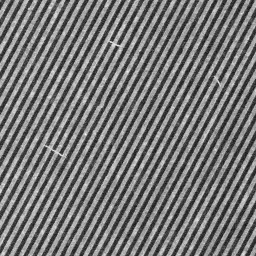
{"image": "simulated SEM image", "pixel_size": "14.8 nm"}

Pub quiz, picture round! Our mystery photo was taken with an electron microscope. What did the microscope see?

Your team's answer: parallel lines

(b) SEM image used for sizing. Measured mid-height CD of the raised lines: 50.6 nm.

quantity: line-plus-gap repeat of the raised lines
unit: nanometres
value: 121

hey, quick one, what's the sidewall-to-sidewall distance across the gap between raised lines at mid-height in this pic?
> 65.3 nanometres